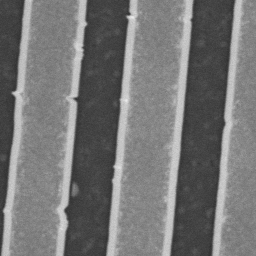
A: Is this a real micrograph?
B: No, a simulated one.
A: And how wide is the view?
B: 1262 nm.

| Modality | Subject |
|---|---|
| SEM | one or a few lines or trenches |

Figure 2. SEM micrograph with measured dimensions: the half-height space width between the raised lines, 240 nm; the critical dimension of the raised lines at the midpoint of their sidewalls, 280 nm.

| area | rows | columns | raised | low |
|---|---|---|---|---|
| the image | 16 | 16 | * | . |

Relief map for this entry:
..***...****...*
..***...****...*
.****...****...*
.****...****...*
.****...***...**
.****...***...**
.****...***...**
.****...***...**
.***....***...**
.***...****...**
.***...****...**
.***...****...**
.***...****...**
****...****...**
****...****...**
****...***...***